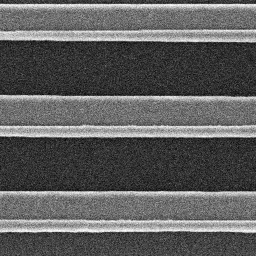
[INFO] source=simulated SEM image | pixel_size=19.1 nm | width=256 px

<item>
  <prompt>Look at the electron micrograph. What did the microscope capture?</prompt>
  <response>lines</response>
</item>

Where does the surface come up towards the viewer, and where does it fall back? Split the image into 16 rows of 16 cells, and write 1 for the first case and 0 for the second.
1111111111111111
1111111111111111
0000001111111111
0000000000000000
0000000000000000
0000000000000000
1111111111111111
1111111111111111
0000000000001101
0000000000000000
0000000000000000
0000000000000000
1111111111111111
1111111111111111
0000000000000000
0000000000000000